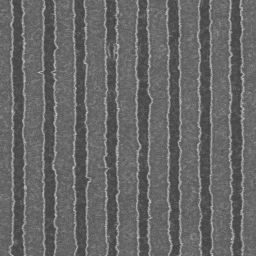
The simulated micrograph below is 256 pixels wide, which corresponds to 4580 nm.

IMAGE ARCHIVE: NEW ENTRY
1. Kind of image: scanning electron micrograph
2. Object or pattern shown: parallel lines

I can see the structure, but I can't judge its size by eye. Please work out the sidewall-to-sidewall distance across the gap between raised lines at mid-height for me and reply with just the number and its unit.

344 nm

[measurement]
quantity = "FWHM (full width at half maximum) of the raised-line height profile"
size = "204 nm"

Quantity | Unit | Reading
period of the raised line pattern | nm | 558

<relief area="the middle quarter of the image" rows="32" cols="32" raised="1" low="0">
00011100001110000011100000111000
00011100001110000011100000111000
00011100000110000011100000111000
00011000001110000011100000111000
00011000001110000001100000111000
00011000000110000011100000111000
00011000000110000011100000111000
00011000000111000011100000111000
00011000001110000011110000111000
00011000001110000011110000111000
00011100000110000011110000111000
00011100000111000011100000111000
00011100000110000011100000111000
00011100000110000011100000111000
00011000001111000011100000111000
00011100000111000011100000111000
00011100000111000011100000111000
00011100001110000011100000111000
00011100001111000011100000111000
00011100001111000001100000111000
00011100001110000001100000111000
00011100000110000001100000111000
00111100000110000001100000111000
00011100001110000011100000111000
00011100001110000011100000111000
00011100001110000011100000111000
00111100000110000011100000111000
00111100001110000011100000111000
00011100000110000011100000111000
00011100001111000011100000111000
00111100000110000011100000111000
00011100001111000011100000111000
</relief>